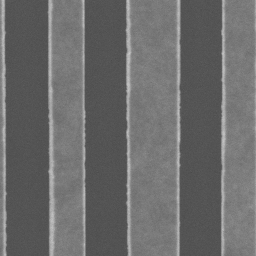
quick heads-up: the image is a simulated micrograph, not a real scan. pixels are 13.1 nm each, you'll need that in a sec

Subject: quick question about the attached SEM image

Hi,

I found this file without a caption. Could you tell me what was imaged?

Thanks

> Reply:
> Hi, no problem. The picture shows lines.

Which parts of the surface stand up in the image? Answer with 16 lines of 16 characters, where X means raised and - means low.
---XX---XXX---XX
---XX---XXX---XX
---XX---XXX---XX
---XX---XXX---XX
---XX---XXX---XX
---XX---XXX---XX
---XX---XXX---XX
---XX---XXX---XX
---XX---XXX---XX
---XX---XXX---XX
---XX---XXX---XX
---XX---XXX---XX
---XX---XXX---XX
---XX---XXX---XX
---XX---XXX---XX
---XX---XXX---XX